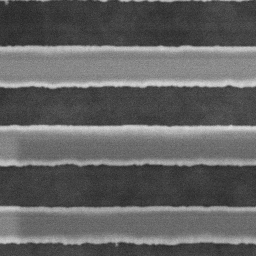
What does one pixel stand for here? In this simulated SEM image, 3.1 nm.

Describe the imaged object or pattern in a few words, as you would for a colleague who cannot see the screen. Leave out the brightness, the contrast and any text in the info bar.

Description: lines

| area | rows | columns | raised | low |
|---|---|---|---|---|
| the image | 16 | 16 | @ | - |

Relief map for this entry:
----------------
----------------
----------------
@@@@@@@@@@@@@@@@
@@@@@@@@@@@@@@@@
----------------
----------------
----------------
@@@@@@@@@@@@@@@@
@@@@@@@@@@@@@@@@
----------------
----------------
----------------
@@@@@@@@@@@@@@@@
@@@@@@@@@@@@@@@@
----------------